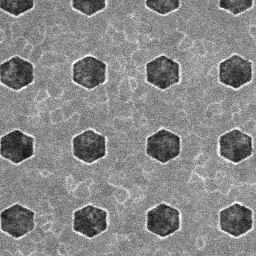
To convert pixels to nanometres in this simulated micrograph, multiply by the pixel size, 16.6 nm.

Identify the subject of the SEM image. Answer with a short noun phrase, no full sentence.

a regular array of holes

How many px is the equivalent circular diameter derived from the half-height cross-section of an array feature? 33.3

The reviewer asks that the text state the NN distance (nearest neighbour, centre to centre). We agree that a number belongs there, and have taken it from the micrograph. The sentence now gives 73.1 px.